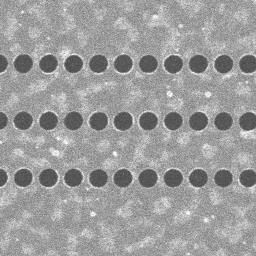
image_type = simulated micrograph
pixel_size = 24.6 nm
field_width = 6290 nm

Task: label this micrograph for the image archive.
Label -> a regular array of holes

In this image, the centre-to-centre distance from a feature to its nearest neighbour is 0.612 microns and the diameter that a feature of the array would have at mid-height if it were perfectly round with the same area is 0.473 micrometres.